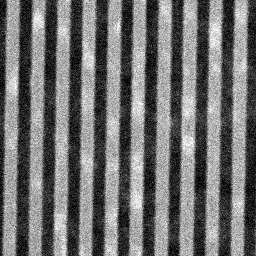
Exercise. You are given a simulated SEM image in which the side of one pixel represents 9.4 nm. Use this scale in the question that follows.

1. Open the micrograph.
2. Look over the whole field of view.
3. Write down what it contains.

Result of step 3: parallel lines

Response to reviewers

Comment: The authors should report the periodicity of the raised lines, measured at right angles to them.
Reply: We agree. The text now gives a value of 0.238 micrometres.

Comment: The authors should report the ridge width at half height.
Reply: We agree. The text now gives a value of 12.5 px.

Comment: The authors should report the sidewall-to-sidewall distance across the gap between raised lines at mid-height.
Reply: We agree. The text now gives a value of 126 nanometers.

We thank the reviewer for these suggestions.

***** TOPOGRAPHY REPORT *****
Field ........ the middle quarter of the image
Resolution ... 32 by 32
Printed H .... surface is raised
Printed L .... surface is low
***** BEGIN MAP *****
HLLLLHHHLLLHHHLLLHHHLLLLHHLLLLHH
HLLLLHHHLLLHHHLLLHHHLLLLHHLLLLHH
HLLLLHHHLLLHHHLLLHHHLLLHHHLLLLHH
HLLLLHHHLLLHHHLLLHHHLLLHHHLLLLHH
HLLLLHHLLLLHHHLLLHHHLLLHHHLLLLHH
HLLLLHHLLLLHHHLLLHHHLLLHHHLLLLHH
HLLLLHHLLLLHHHLLLHHHLLLHHHLLLLHH
HLLLLHHLLLLHHHLLLHHHLLLHHHLLLLHH
HLLLLHHLLLLHHHLLLHHHLLLHHHLLLLHH
HLLLLHHLLLLHHHLLLHHHLLLHHHLLLLHH
HLLLHHHLLLLHHHLLLHHHLLLHHHLLLLHH
HLLLHHHLLLLHHHLLLHHHLLLHHHLLLLHH
HLLLHHHLLLLHHHLLLHHHLLLHHHLLLLHH
HLLLHHHLLLLHHHLLLHHHLLLHHHLLLLHH
HLLLHHHLLLLHHHLLLHHHLLLLHHLLLLHH
HLLLHHHLLLLHHHLLLHHHLLLHHHLLLLHH
HLLLHHHLLLLHHHLLLHHHLLLHHHLLLLHH
HLLLHHHLLLLHHHLLLHHHLLLHHHLLLLHH
HLLLHHHLLLLHHHLLLHHHLLLHHHLLLLHH
HLLLHHHLLLLHHHLLLHHHLLLHHHLLLLHL
HLLLHHHLLLLHHHLLLHHHLLLHHHLLLLHH
HLLLHHHLLLLHHHLLLHHHLLLHHHLLLLHH
HLLLHHHLLLLHHLLLLHHHLLLHHHLLLLHH
HLLLHHHLLLLHHLLLLHHHLLLHHHLLLLHH
HLLLHHHLLLLHHLLLLHHHLLLHHHLLLLHH
HLLLHHHLLLLHHLLLLHHHLLLHHHLLLLHH
HLLLHHHLLLLHHLLLLHHHLLLHHHLLLLHH
HLLLHHHLLLLHHLLLLHHHLLLHHHLLLLHH
HLLLHHHLLLHHHLLLLHHHLLLHHHLLLLHH
HLLLHHHLLLHHHLLLLHHHLLLHHHLLLLHH
HLLLHHHLLLHHHLLLLHHHLLLHHHLLLLHH
HLLLHHHLLLHHHLLLLHHHLLLHHHLLLLHH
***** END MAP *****